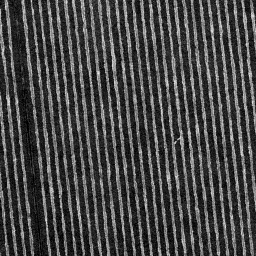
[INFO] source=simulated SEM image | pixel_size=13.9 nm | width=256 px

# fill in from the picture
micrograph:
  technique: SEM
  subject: parallel lines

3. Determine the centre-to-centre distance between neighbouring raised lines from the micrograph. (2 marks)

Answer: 117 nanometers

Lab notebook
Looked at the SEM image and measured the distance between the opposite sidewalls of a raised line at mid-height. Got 29.4 nanometres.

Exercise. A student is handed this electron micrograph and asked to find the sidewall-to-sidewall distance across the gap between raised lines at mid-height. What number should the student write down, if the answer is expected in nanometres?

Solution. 86.6